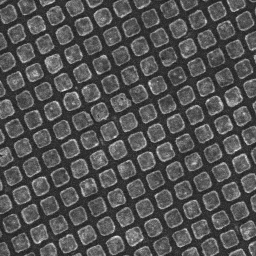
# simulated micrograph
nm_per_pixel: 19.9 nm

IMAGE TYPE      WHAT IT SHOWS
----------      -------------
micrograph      a regular array of raised bodies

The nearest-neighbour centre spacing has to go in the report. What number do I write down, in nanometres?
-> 416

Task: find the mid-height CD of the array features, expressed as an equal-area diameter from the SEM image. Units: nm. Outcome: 340